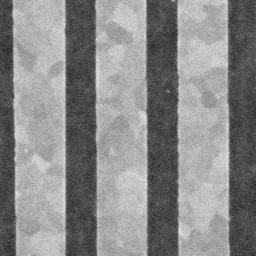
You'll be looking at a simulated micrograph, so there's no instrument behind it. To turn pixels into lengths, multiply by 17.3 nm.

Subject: lines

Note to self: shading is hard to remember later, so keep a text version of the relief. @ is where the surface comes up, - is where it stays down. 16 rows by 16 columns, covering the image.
-@@@--@@@--@@@--
-@@@--@@@--@@@--
-@@@--@@@--@@@--
-@@@--@@@--@@@--
-@@@--@@@--@@@--
-@@@--@@@--@@@--
-@@@--@@@--@@@--
-@@@--@@@--@@@--
-@@@--@@@--@@@--
-@@@--@@@--@@@--
-@@@--@@@--@@@--
-@@@--@@@--@@@--
-@@@--@@@--@@@--
-@@@--@@@--@@@--
-@@@--@@@--@@@--
-@@@--@@@--@@@--